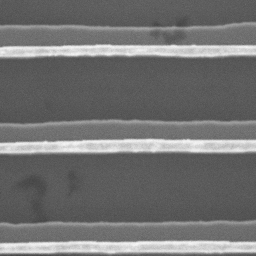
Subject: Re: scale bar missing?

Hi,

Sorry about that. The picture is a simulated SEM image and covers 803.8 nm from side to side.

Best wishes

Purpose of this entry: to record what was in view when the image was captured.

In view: lines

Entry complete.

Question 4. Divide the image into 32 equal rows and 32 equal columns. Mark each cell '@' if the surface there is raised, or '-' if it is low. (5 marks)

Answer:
--------------------------------
--------------------------------
--------------------------------
@@@@@@@@@@@@@@@@@@@@@@@@@@@@@@@@
@@@@@@@@@@@@@@@@@@@@@@@@@@@@@@@@
@@@@@@@@@@@@@@@@@@@@@@@@@@@@@@@@
@@@@@@@@@@@@@@@@@@@@@@@@@@@@@@@@
--------------------------------
--------------------------------
--------------------------------
--------------------------------
--------------------------------
--------------------------------
--------------------------------
--------------------------------
@@@@@@@@@@@@@@@@@@@@@@@@@@@@@@@@
@@@@@@@@@@@@@@@@@@@@@@@@@@@@@@@@
@@@@@@@@@@@@@@@@@@@@@@@@@@@@@@@@
@@@@@@@@@@@@@@@@@@@@@@@@@@@@@@@@
--------------------------------
--------------------------------
--------------------------------
--------------------------------
--------------------------------
--------------------------------
--------------------------------
--------------------------------
--------------------------------
@@@@@@@@@@@@@@@@@@@@@@@@@@@@@@@@
@@@@@@@@@@@@@@@@@@@@@@@@@@@@@@@@
@@@@@@@@@@@@@@@@@@@@@@@@@@@@@@@@
@@@@@@@@----@@@@------@@-@@@----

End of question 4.